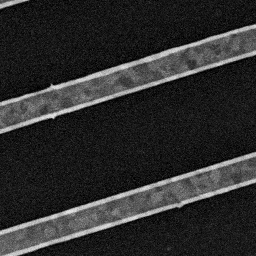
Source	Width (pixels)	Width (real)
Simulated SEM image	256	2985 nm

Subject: one or a few lines or trenches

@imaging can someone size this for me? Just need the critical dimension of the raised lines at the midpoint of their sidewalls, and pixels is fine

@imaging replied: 25.2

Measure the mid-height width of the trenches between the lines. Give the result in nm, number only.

1130